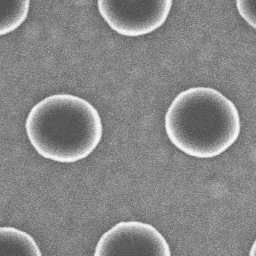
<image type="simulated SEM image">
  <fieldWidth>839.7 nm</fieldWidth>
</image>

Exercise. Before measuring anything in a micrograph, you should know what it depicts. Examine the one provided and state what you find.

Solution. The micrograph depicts raised bodies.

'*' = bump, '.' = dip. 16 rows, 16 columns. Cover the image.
**....*****....*
*......***......
................
................
................
................
..***......***..
..****....*****.
..****.....****.
...***......**..
................
................
................
................
*......***......
**....****......